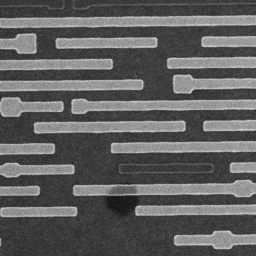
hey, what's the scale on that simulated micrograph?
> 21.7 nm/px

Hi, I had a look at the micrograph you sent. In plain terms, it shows wiring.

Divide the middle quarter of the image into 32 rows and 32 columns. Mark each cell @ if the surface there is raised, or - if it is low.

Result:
@@@@@@@@@@@@--------------@@@@@@
--------------------------------
--------------------------------
----------------------------@@@@
@@@@@@@@@@@@@@@@@@@@--------@@@@
@@@@@@@@@@@@@@@@@@@@--------@@@@
@@@@@@----------------------@@@@
--------------------------------
--------------------------------
--@@@@@@@@@@@@@@@@@@@@@@@@@@@@@@
--@@@@@@@@@@@@@@@@@@@@@@@@@@@@@@
--@@@@--------------------------
--------------------------------
--------------------------------
--------------@@@@@@@@@@@@@@@@--
@@@@@@@@@@@@@@@@@@@@@@@@@@@@@@--
@@@@@@@@@@@@@@@@@@@@@@@@@@@@@@--
--------------------------------
--------------------------------
--------------------------------
------------@@@@@@@@@@@@@@@@@@@@
------------@@@@@@@@@@@@@@@@@@@@
--------------------------------
--------------------------------
--------------------------------
@@------------@@@@@@@@@@@@@@@@@@
@@------------@@@@@@@@@@@@@@@@@@
--------------------------------
--------------------------------
--------------------------------
---@@@@@@@@@@@@@@@@@@@@@@@@@@@@@
--@@@@@@@@@@@@@@@@@@@@@@@@@@@@@@